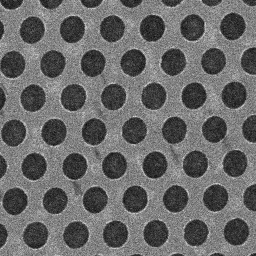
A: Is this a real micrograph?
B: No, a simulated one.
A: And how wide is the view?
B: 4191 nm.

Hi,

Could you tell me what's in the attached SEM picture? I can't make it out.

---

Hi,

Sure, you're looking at a regular array of holes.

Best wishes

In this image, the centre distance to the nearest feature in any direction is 0.646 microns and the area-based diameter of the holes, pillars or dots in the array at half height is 435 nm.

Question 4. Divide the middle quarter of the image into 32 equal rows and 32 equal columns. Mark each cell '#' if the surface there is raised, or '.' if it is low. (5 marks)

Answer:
####......####......####......##
####......####......#####.....##
#####....######....#######...###
################################
################################
#...#######...#######....#####..
.....#####.....#####.....#####..
......###.......###.......###...
......###.......###.......###...
.....####......####......#####..
.....#####.....#####.....#####..
#...#######..#########.#########
################################
################...#######...###
#####.....#####.....#####.....##
.####.....#####......####......#
.###.......###.......###.......#
.###.......###.......###.......#
#####.....#####.....#####.....##
#####.....######...#######...###
#######.########################
################################
##..#######....######....######.
.....#####.....#####......####..
......####......####......####..
......###.......###.......####..
......####......####......####..
.....#####.....#####.....######.
#...#######...#######...########
################################
#################..########..###
######....#####.....######.....#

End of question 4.